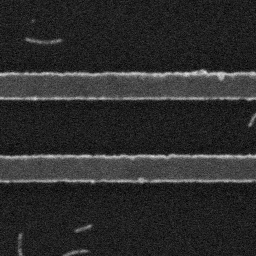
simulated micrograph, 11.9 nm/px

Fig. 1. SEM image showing lines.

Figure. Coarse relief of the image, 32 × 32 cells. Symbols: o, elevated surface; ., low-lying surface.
................................
................................
................................
................................
................................
................................
................................
................................
................................
oooooooooooooooooooooooooooooooo
oooooooooooooooooooooooooooooooo
oooooooooooooooooooooooooooooooo
................................
................................
................................
................................
................................
................................
................................
o...ooooooooo.oooooo.ooooooooooo
oooooooooooooooooooooooooooooooo
oooooooooooooooooooooooooooooooo
oooooooooooooooooooooooooooooooo
................................
................................
................................
................................
................................
................................
................................
................................
................................